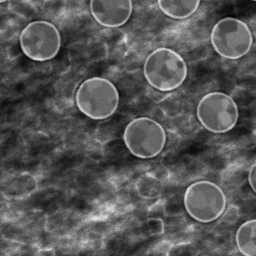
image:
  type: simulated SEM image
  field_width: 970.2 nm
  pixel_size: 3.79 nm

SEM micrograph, raised bodies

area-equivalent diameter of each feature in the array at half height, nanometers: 151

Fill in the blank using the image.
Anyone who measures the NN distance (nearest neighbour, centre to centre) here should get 0.258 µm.